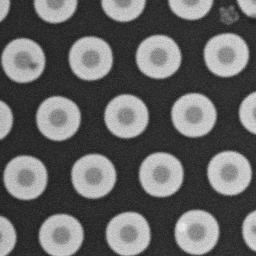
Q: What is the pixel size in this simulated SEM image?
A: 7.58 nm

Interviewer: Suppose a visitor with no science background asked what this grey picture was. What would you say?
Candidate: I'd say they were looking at an array of small figures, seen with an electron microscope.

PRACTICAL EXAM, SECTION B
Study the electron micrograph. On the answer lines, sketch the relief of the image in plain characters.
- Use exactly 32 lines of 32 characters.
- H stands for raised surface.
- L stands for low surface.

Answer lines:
HLLLHHHHHHLLLHHHHHLLLHHHHHLLLLHH
HLLLLHHHHLLLLHHHHHLLLLHHHHLLLLHH
LLLLLLHHLLLLLLLHLLLLLLLLLLLLLLLL
LLLLLLLLLLLLLLLLLLLLLLLLLLLLLLLL
LLLLLLLLLLLLLLLLLLLHHLLLLLLHHHLL
LHHHHLLLLHHHHLLLLLHHHHLLLLHHHHHL
HHHHHLLLLHHHHHLLLHHHHHHLLLHHHHHL
HHHHHHLLLHHHHHLLLHHHHHHLLLHHHHHL
HHHHHLLLLHHHHHLLLHHHHHLLLLHHHHLL
LHHHHLLLLLHHHLLLLLLHHLLLLLLHHLLL
LLLLLLLLLLLLLLLLLLLLLLLLLLLLLLLL
LLLLLLLLLLLLLLLLLLLLLLLLLLLLLLLL
LLLLLLHHHLLLLLHHHHLLLLHHHHLLLLLH
HLLLLHHHHHLLLHHHHHLLLLHHHHHLLLHH
HHLLLHHHHHLLLHHHHHLLLHHHHHHLLLHH
HLLLLHHHHHLLLHHHHHLLLLHHHHHLLLHH
HLLLLHHHHLLLLLHHHHLLLLHHHHLLLLLH
LLLLLLLHLLLLLLLLLLLLLLLLLLLLLLLL
LLLLLLLLLLLLLLLLLLLLLLLLLLLLLLLL
LLLLLLLLLLLHHLLLLLLHHHLLLLLHHHLL
LHHHHLLLLHHHHHLLLLHHHHHLLLHHHHHL
LHHHHHLLLHHHHHLLLHHHHHHLLLHHHHHL
HHHHHHLLLHHHHHLLLHHHHHHLLLHHHHHL
LHHHHHLLLHHHHHLLLLHHHHLLLLLHHHHL
LLHHHLLLLLHHHLLLLLLHHLLLLLLLLLLL
LLLLLLLLLLLLLLLLLLLLLLLLLLLLLLLL
LLLLLLLLLLLLLLLLLLLLLLLLHHLLLLLL
HLLLLLHHHHLLLLHHHHLLLLHHHHHLLLLH
HHLLLHHHHHLLLHHHHHHLLLHHHHHLLLHH
HHLLLHHHHHLLLHHHHHHLLLHHHHHLLLHH
HHLLLHHHHHLLLLHHHHHLLLHHHHHLLLLH
HLLLLLHHHLLLLLHHHHLLLLLHHHLLLLLL